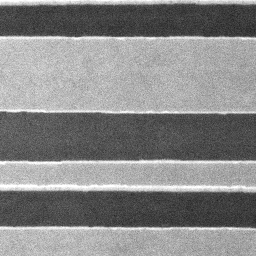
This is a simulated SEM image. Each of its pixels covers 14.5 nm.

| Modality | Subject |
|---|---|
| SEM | lines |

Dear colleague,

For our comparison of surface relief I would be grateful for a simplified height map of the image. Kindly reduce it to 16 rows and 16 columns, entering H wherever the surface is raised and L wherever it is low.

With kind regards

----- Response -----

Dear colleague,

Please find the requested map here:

LLLLLLLLLLLLLLLL
LLLLLLLLLLLLLLLL
HHHHHHHHHHHHHHHH
HHHHHHHHHHHHHHHH
HHHHHHHHHHHHHHHH
HHHHHHHHHHHHHHHH
HHHHHHHHHHHHHHHH
LLLLLLLLLLLLLLLL
LLLLLLLLLLLLLLLL
LLLLLLLLLLLLLLLL
HHHHHHHHHHHHHHHH
HHHHHHHHHHHHHHHH
LLLLLLLLLLLLLLLL
LLLLLLLLLLLLLLLL
HHHHHHHHHHHHHHHH
HHHHHHHHHHHHHHHH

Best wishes